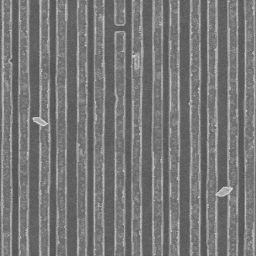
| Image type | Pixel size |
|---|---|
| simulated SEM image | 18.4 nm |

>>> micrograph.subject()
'parallel lines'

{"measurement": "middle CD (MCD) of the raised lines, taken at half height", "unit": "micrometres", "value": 0.177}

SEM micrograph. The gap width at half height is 7.75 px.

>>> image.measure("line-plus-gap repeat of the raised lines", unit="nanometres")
344